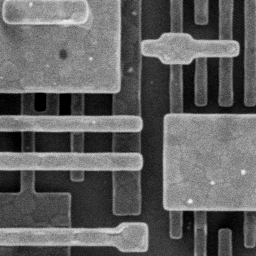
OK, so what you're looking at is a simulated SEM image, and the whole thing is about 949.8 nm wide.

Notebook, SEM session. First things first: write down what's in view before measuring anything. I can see wiring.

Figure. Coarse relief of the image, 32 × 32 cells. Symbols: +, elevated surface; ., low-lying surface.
+++++++++++++++.................
+++++++++++++++.................
+++++++++++++++.................
+++++++++++++++.................
+++++++++++++++.....++++........
+++++++++++++++...++++++++++++..
+++++++++++++++...++++++++++++..
+++++++++++++++.....++++........
+++++++++++++++.................
+++++++++++++++.................
+++++++++++++++.................
++++.++++++++++.................
................................
................................
++++.+........++.....+++++++++++
++++++++++++++++++..++++++++++++
......++......+++...++++++++++++
....................++++++++++++
....................++++++++++++
++++++++++++++++++..++++++++++++
++++++++++++++++++..++++++++++++
....................++++++++++++
....................++++++++++++
....................++++++++++++
....................++++++++++++
....................++++++++++++
................................
................................
..............++++..............
++++++++++++++++++..............
++++++++++++++++++..............
................................